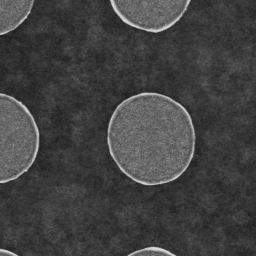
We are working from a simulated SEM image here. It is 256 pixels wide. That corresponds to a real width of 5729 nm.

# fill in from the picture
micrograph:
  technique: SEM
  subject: raised bodies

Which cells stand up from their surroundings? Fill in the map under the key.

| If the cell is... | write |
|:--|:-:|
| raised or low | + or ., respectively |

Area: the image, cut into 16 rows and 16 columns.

++.....+++++....
+.......+++.....
................
................
................
................
+.......+++.....
++.....+++++....
++.....+++++....
++.....+++++....
++......++++....
.........+......
................
................
................
................